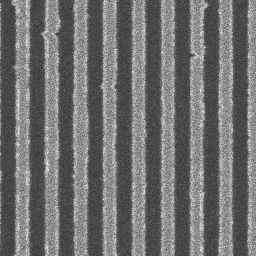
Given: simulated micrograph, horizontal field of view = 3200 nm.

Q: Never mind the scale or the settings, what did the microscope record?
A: parallel lines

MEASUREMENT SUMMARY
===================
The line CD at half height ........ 198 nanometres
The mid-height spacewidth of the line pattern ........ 166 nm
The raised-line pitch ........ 363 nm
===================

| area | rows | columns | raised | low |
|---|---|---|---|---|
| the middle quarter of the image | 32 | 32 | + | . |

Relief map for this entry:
..++++....+++....+++....++++....
..++++....+++....+++....++++....
..++++....+++....+++....++++....
..++++....+++....+++....++++....
..++++...++++....+++....++++....
..++++...++++....+++....++++....
..++++...++++....+++....++++....
..++++....+++....+++....++++....
..++++....+++....+++....++++....
..++++....+++....+++....++++....
..++++....+++....+++....++++....
..++++....+++....+++....++++....
..++++....+++....+++....++++....
..++++....+++....+++....++++....
..++++....+++....+++....++++....
..++++....+++....+++....+++.....
..++++....+++....++++...+++.....
..++++....+++....++++...++++....
..++++....+++....+++....++++...+
..++++....+++....+++....++++...+
..++++....+++....+++....++++...+
..++++....+++....+++....++++...+
..++++....+++....+++....++++...+
..++++....+++....+++....++++...+
..++++....+++....+++....++++...+
..++++....+++....+++....++++...+
..++++....+++....+++....++++...+
..++++....+++....+++....++++...+
..++++....+++....+++....++++...+
..++++....+++....+++....++++...+
..++++....+++....++++...++++...+
..++++....+++....+++....++++...+